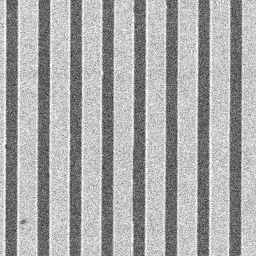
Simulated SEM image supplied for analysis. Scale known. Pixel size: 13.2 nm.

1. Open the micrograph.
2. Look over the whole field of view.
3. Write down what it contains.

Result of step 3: parallel lines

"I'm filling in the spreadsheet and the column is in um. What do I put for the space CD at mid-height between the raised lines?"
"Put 0.177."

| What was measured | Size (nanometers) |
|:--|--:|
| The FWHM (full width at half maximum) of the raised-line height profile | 240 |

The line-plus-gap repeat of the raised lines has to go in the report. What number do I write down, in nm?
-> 423